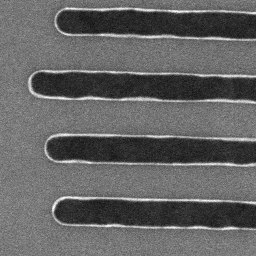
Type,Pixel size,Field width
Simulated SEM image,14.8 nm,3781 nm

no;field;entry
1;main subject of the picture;groups of lines, slits or small figures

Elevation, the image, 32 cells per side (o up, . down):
................................
.......ooooooooooooooooooooooo..
.......ooooooooooooooooooooooooo
.......ooooooooooooooooooooooooo
..............oooooooooooooooooo
................................
................................
................................
................................
....oooooooooooooooooooooooo....
....oooooooooooooooooooooooooooo
....oooooooooooooooooooooooooooo
....................oooooo..oooo
................................
................................
................................
................................
......ooooooooooooooooooooooooo.
......oooooooooooooooooooooooooo
......oooooooooooooooooooooooooo
....................oooo....oooo
................................
................................
................................
................................
.......ooooooooooooooooooooooooo
.......ooooooooooooooooooooooooo
.......ooooooooooooooooooooooooo
.........................ooooooo
................................
................................
................................